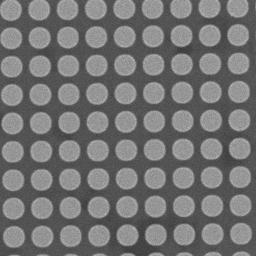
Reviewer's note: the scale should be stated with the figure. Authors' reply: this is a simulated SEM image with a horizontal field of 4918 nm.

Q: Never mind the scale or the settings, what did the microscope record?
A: an array of small figures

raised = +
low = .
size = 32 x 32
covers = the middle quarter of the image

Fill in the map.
++++..+++++..+++++..+++++..+++++
+++...++++...++++...+++++..+++++
+++....+++....+++....++.....+++.
................................
................................
+++....+++....+++...++++....++++
++++..+++++..+++++..+++++..+++++
++++..+++++..+++++..+++++..+++++
++++..+++++..+++++..+++++..+++++
+++...++++....+++....+++....+++.
................................
................................
+++....+++....+++....+++....++++
++++..+++++..+++++..+++++..+++++
++++..+++++..+++++..+++++..+++++
++++..+++++..+++++..+++++..+++++
+++....+++....+++....+++....+++.
................................
................................
+++....+++....+++....+++....++++
++++..+++++..+++++..+++++..+++++
++++..+++++..+++++..+++++..+++++
++++..+++++..+++++..+++++..+++++
+++....+++....+++....+++....+++.
................................
................................
+++....+++....+++....+++....++++
++++..+++++..+++++..+++++..+++++
++++..+++++..+++++..+++++..+++++
++++..+++++..+++++..+++++..+++++
+++...+++++...++++...++++...+++.
................................